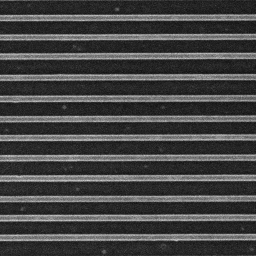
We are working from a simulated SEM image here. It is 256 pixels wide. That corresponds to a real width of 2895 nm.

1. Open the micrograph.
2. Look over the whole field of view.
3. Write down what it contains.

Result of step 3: parallel lines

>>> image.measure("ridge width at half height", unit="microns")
0.0608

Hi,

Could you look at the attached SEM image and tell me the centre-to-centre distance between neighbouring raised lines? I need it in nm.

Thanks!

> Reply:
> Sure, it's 226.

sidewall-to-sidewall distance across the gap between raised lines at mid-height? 170 nm